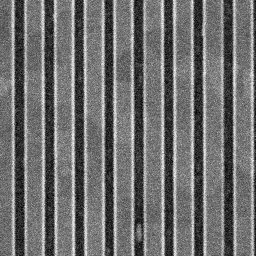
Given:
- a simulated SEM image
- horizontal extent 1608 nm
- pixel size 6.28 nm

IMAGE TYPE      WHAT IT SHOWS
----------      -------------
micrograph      parallel lines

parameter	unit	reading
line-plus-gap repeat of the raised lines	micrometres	0.188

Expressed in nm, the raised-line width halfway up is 118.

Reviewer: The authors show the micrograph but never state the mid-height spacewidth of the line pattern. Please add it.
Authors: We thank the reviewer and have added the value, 0.0683 um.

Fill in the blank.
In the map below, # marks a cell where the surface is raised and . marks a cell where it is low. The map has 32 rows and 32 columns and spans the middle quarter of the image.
##...#####...####...#####...####
##...#####...####...#####...####
##...#####...####...#####...####
##...#####...####...#####...####
##...#####...####...#####...####
##...#####...####...#####...####
##...#####...####...#####...####
##...#####...####...#####...####
##...#####...####...#####...####
##...#####...####...#####...####
##...#####...####...#####...####
##...#####...####...#####...####
##...#####...####...#####...####
##...#####...####...#####...####
##...#####...####...#####...####
##...#####...####...#####...####
##...#####...####...#####...####
##...#####...####...#####...####
##...#####...####...#####...####
##...#####...####...#####...####
##...#####...####...#####...####
##...#####...####...#####...####
##...#####...####...#####...####
##...#####...####...#####...####
##...#####...####...#####...####
##...#####...####...#####...####
##...#####...####...#####...####
##...#####...####...#####...####
##...#####...####...#####...####
##...#####...####...#####...####
##...#####...####...#####...####
##...#####...####...#####...####